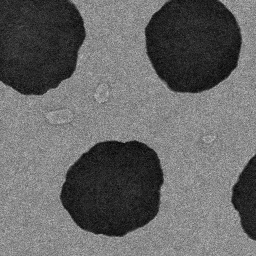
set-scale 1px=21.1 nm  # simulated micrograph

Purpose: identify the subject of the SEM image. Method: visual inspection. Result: holes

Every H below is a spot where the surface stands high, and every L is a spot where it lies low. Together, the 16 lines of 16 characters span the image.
LLLLLHHHHHLLLLHH
LLLLLHHHHLLLLLLH
LLLLLHHHHLLLLLLH
LLLLLHHHHLLLLLLH
LLLLLHHHHHLLLLLH
HLLHHHHHHHHLLHHH
HHHHHHHHHHHHHHHH
HHHHHHHHHHHHHHHH
HHHHHHHHHHHHHHHH
HHHHHLLLLLHHHHHH
HHHHLLLLLLHHHHHL
HHHHLLLLLLHHHHHL
HHHHLLLLLLHHHHLL
HHHHLLLLLLHHHHHL
HHHHHHLLHHHHHHHL
HHHHHHHHHHHHHHHH